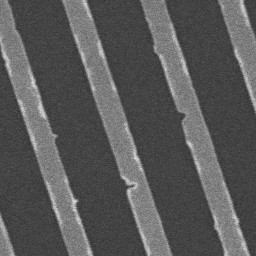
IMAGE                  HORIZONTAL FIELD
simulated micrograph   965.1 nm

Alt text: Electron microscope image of one or a few lines or trenches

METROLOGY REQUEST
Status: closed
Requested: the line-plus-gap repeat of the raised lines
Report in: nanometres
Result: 279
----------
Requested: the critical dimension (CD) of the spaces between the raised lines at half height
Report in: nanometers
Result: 196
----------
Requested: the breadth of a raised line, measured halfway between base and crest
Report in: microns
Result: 0.0835